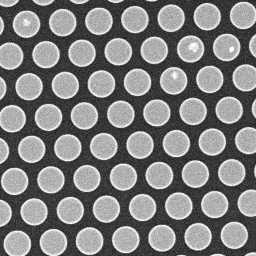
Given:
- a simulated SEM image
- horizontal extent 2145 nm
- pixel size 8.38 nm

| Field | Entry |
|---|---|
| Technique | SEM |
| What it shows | an array of small figures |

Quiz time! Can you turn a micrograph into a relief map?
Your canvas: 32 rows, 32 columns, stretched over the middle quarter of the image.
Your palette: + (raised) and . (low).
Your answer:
....+...........................
.................+++......+++...
++.....++++.....+++++....+++++..
+++...++++++...++++++...+++++++.
+++...+++++++..+++++++..+++++++.
+++...+++++++..+++++++..++++++..
+++....+++++....+++++....+++++..
+++....+++++.....+++............
................................
.............+++.....++++.....++
...++++.....+++++...++++++...+++
..++++++...++++++...++++++...+++
..++++++...++++++...++++++...+++
..++++++...++++++...++++++...+++
..++++++....+++++....+++++....++
...++++......+++.......+........
................................
.........++......++++.....++++..
+++....+++++....++++++...++++++.
++++...++++++...++++++...++++++.
++++...++++++...++++++...++++++.
++++...++++++...++++++...++++++.
++++...++++++....++++.....++++..
+++......+++......+.............
...............................+
.....++......++++....+++++....++
...+++++....++++++...++++++...++
...++++++...++++++...++++++...++
...++++++...++++++...++++++...++
...++++++...++++++...++++++...++
...+++++.....++++.....++++.....+
....++++........................